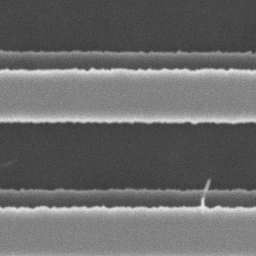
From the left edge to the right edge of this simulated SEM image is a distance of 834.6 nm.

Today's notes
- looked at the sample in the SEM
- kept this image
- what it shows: lines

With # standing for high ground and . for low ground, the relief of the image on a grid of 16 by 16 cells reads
................
................
................
################
################
################
################
################
................
................
................
................
################
################
################
################